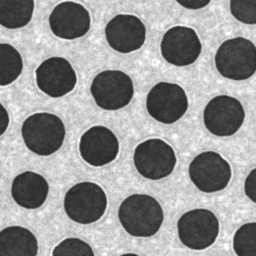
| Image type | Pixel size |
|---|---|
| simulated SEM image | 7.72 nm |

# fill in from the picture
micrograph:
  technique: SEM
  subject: a regular array of holes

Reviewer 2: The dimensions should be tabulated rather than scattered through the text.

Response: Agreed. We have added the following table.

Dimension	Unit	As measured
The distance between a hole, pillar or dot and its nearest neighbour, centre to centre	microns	0.439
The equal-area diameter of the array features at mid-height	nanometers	322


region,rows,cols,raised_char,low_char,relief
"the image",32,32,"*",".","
....***...************....***...
....**.....******************...
....**.....***....************..
*.****.....**.....***...********
*******...***.....**.....*******
.*************....**.....***....
..*************.****.....**.....
...***..*************....**.....
...**....******************.....
..**......**....************...*
.****....**......***..**********
*****....**......**....*********
************....**.....***....**
.************..***.....***....**
.***...************....**......*
.**.....******************....**
.**.....***...************...***
***.....**.....***..************
****...***.....**....***********
**********.....**.....***...****
***********..****.....**.....***
***.*************....***.....**.
**....*************.****.....**.
*.....***....************...***.
*.....**.....***...************.
**...***.....**.....************
********.....**.....***...******
*********...***.....**.....*****
*..************.....**.....***..
....*************..***.....**...
.....**....************....**...
.....**.....*****************...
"